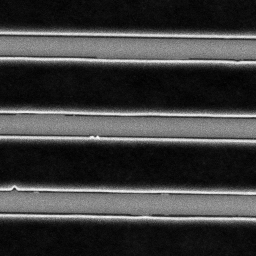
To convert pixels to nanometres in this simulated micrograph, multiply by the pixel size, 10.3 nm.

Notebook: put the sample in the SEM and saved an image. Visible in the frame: one or a few lines or trenches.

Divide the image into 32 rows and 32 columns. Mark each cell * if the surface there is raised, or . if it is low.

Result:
********************************
********************************
********************************
********************************
.......................*********
................................
................................
************....................
********************************
********************************
********************************
********************************
********************************
********************************
................................
................................
................................
**********************..........
********************************
********************************
********************************
********************************
********************************
********************************
................................
................................
................................
********************************
********************************
********************************
********************************
********************************